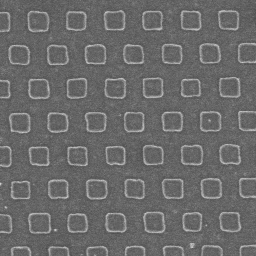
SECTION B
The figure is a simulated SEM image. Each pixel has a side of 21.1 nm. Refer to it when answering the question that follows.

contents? a regular array of raised bodies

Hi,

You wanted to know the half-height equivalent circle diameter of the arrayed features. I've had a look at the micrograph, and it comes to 446 nanometres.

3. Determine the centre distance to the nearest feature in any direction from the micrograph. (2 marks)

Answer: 0.799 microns